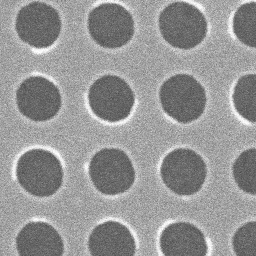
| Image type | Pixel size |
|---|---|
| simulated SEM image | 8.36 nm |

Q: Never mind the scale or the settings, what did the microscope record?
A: a regular array of holes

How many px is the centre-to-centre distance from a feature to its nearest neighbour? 71.9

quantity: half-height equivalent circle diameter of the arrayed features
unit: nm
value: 393